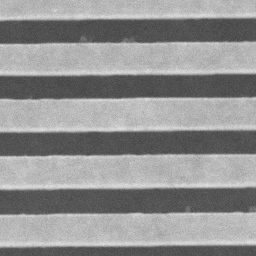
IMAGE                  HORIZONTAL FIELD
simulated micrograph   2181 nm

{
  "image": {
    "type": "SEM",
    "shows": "lines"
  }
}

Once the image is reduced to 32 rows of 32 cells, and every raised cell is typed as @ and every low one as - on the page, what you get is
@@@@@@@@@@@@@@@@@@@@@@@@@@@@@@@@
@@@@@@@@@@@@@@@@@@@@@@@@@@@@@@@@
@-------------------------------
--------------------------------
--------------------------------
-----@@@@@@@@@@@@@@@@@@@@@@@@@@@
@@@@@@@@@@@@@@@@@@@@@@@@@@@@@@@@
@@@@@@@@@@@@@@@@@@@@@@@@@@@@@@@@
@@@@@@@@@@@@@@@@@@@@@@@@@@@@@@@@
--------------------------------
--------------------------------
--------------------------------
@@-@-@@@@@@@@@@@@@@@@@@@@@@@@@@@
@@@@@@@@@@@@@@@@@@@@@@@@@@@@@@@@
@@@@@@@@@@@@@@@@@@@@@@@@@@@@@@@@
@@@@@@@@@@@@@@@@@@@@@@@@@@@@@@@@
--------------------------------
--------------------------------
--------------------------------
---@--@@@@@@@@@@@@@@@@@@@@@@@@@@
@@@@@@@@@@@@@@@@@@@@@@@@@@@@@@@@
@@@@@@@@@@@@@@@@@@@@@@@@@@@@@@@@
@@@@@@@@@@@@@@@@@@@@@@@@@@@@@@@@
@@@@@@@@@@@@@@@@@@@-------------
--------------------------------
--------------------------------
--------------------------------
@@@@@@@@@@@@@@@@@@@@@@@@@@@@@@@@
@@@@@@@@@@@@@@@@@@@@@@@@@@@@@@@@
@@@@@@@@@@@@@@@@@@@@@@@@@@@@@@@@
@@@@@@@@@@@@@@@@@@@@@@@@@@@@@@@@
--------------------------------